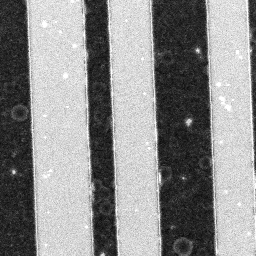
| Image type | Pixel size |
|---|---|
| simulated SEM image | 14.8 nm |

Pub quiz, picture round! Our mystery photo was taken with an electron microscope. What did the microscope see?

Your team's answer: one or a few lines or trenches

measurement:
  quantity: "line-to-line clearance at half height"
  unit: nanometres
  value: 618